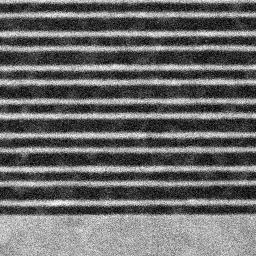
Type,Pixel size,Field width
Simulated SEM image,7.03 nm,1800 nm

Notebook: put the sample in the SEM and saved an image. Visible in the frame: parallel lines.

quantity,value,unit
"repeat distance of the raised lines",120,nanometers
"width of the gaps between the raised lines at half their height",0.0791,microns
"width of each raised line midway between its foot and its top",0.0255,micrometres